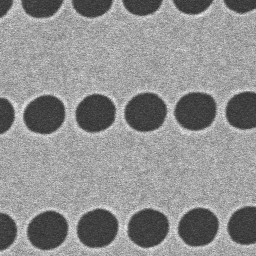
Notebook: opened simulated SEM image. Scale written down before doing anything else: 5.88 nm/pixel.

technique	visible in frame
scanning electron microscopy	a regular array of holes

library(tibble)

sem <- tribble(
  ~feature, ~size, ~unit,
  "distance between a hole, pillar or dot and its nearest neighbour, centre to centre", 294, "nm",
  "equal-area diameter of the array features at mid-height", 239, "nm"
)